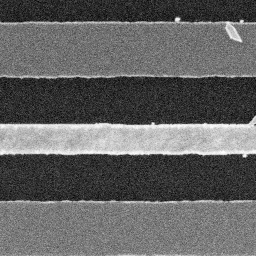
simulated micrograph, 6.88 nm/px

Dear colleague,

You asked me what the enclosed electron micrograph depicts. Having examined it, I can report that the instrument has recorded lines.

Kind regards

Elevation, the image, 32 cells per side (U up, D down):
DDDDDDDDDDDDDDDDDDDDDDDDDDDDDDDD
DDDDDDDDDDDDDDDDDDDDDDDDDDDDDDDD
DDDDDDDDDDDDDDDDDDDDDDDDDDDDDDDD
UUUUUUUUUUUUUUUUUUUUUUUUUUUUUUUU
UUUUUUUUUUUUUUUUUUUUUUUUUUUUUUUU
UUUUUUUUUUUUUUUUUUUUUUUUUUUUUUUU
UUUUUUUUUUUUUUUUUUUUUUUUUUUUUUUU
UUUUUUUUUUUUUUUUUUUUUUUUUUUUUUUU
UUUUUUUUUUUUUUUUUUUUUUUUUUUUUUUU
UUUUUUUUUUUUUUUUUDUUUUUUUUUUUUUU
DDDDDDDDDDDDDDDDDDDDDDDDDDDDDDDD
DDDDDDDDDDDDDDDDDDDDDDDDDDDDDDDD
DDDDDDDDDDDDDDDDDDDDDDDDDDDDDDDD
DDDDDDDDDDDDDDDDDDDDDDDDDDDDDDDD
DDDDDDDDDDDDDDDDDDDDDDDDDDDDDDDD
DDDDDDDDDDDDDDDDDDDDDDDDDDDDDDDU
UUUUUUUUUUUUUUUUUUUUUUUUUUUUUUUU
UUUUUUUUUUUUUUUUUUUUUUUUUUUUUUUU
UUUUUUUUUUUUUUUUUUUUUUUUUUUUUUUU
DDDDDDDDDDDDDDDDDDDDDDDDDDDDDDDD
DDDDDDDDDDDDDDDDDDDDDDDDDDDDDDDD
DDDDDDDDDDDDDDDDDDDDDDDDDDDDDDDD
DDDDDDDDDDDDDDDDDDDDDDDDDDDDDDDD
DDDDDDDDDDDDDDDDDDDDDDDDDDDDDDDD
DDDDDDDDDDDDDDDDDDDDDDDDDDDDDDDD
UUUUUUUUUUUUUUUUUUUUUUUUUUUUUUUU
UUUUUUUUUUUUUUUUUUUUUUUUUUUUUUUU
UUUUUUUUUUUUUUUUUUUUUUUUUUUUUUUU
UUUUUUUUUUUUUUUUUUUUUUUUUUUUUUUU
UUUUUUUUUUUUUUUUUUUUUUUUUUUUUUUU
UUUUUUUUUUUUUUUUUUUUUUUUUUUUUUUU
UUUUUUUUUUUUUUUUUUUUUUUUUUUUUUUU